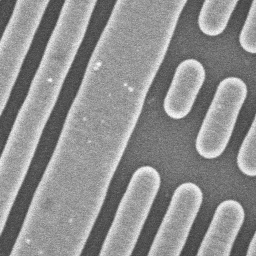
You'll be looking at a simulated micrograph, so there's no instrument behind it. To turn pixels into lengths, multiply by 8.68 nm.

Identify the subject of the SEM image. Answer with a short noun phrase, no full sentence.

groups of lines, slits or small figures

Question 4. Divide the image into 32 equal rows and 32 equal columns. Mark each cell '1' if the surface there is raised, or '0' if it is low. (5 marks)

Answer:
00111100111100111111111000111000
00111000111000111111111001111001
01111001111000111111110001110001
01111001111001111111110001110011
11110011110001111111100000000011
11110011110011111111100000000011
11100011100011111111100000000000
11100111100111111111000100000000
11100111100111111111001110000000
11001111000111111110001111000000
11001111001111111110011110011110
10001110001111111100011110011110
10011110011111111100011100011110
00011110011111111100011100111100
00111100111111111000011000111100
00111100111111111000000001111000
01111000111111110000000001111001
01111001111111110000000001111001
01110001111111110000000001110011
11110001111111100000000001100011
11110011111111100000000000000011
11100011111111000111000000000011
11100111111111001111000000000000
11000111111110001111001110000000
11001111111110011110001110000000
11001111111110011110011110001100
10001111111100011110011110011100
10011111111100111100111100011100
00011111111000111100111100111100
00111111111001111001111000111000
00111111111001111001111001111001
01111111110001110001111001111001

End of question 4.